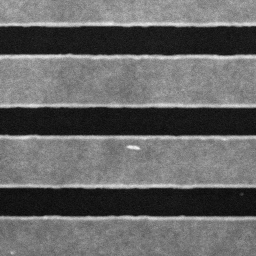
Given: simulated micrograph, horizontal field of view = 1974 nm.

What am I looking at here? lines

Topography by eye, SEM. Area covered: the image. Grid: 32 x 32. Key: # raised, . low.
################################
################################
################################
................................
................................
................................
................................
################################
################################
################################
################################
################################
################################
................................
................................
................................
................................
################################
################################
################################
################################
################################
################################
......#........##.....#.........
................................
................................
................................
################################
################################
################################
################################
################################